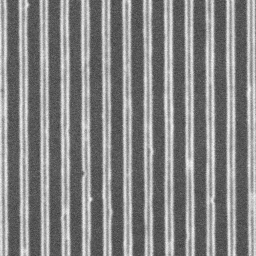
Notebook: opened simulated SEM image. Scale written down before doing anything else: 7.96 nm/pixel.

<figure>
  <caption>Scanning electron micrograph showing parallel lines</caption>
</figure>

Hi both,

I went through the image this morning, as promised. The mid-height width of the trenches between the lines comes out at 113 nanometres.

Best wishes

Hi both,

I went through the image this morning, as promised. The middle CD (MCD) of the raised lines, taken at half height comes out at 49.7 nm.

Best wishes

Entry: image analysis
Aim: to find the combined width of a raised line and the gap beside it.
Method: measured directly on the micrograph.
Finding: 20.7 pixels